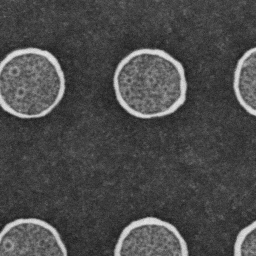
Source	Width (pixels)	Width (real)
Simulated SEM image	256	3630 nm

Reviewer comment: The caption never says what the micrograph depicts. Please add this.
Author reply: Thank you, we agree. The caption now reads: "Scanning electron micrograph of raised bodies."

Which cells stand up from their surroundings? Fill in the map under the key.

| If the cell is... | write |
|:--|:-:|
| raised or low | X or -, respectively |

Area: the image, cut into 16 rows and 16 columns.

----------------
----------------
----------------
-XX-----XX-----X
XXXX---XXXX----X
XXXX---XXXX----X
XXX-----XXX----X
----------------
----------------
----------------
----------------
----------------
----------------
----------------
XXX-----XXX----X
XXXX---XXXX----X